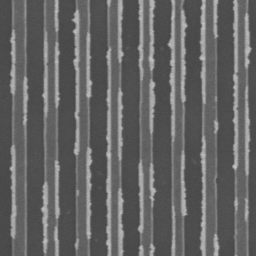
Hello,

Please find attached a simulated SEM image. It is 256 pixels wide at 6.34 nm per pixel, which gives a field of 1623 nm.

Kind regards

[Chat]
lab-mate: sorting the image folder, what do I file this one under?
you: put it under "parallel lines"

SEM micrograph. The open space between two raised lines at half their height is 109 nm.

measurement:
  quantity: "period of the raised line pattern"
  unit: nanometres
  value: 201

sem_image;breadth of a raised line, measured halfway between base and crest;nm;91.1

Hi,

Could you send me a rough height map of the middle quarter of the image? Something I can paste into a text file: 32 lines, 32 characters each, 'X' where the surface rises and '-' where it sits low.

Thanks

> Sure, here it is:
---XXX-----XXX-----XXX-----XXX--
---XXX-----XXX-----XXX-----XXX--
---XXX-----XXX-----XXX-----XXX--
---XXX-----XXX-----XXX-----XXX--
---XXXX----XXX-----XXX----XXXX--
---XXXX----XXX-----XXXX----XXX--
---XXXX----XXX-----XXX-----XXX--
---XXXX----XXX-----XXXX----XXX--
---XXX-----XXX-----XXXX----XXX--
---XXX-----XXX-----XXXX----XXX--
---XXX-----XXXX----XXX-----XXX--
---XXX-----XXX-----XXX-----XXX--
---XXX-----XXX-----XXX-----XXX--
---XXX-----XXX-----XXX-----XXX--
---XXX-----XXX-----XXX-----XXX--
---XXX-----XXXX----XXX-----XXX--
---XXX-----XXXX----XXX-----XXX--
---XXX-----XXX-----XXX-----XXX--
---XXX-----XXXX----XXX-----XXX--
---XXX-----XXXX----XXX-----XXX--
---XXX-----XXXX----XXX-----XXX--
---XXXX----XXX-----XXX-----XXX--
---XXXX----XXX-----XXX-----XXX--
---XXXX----XXX-----XXX-----XXX--
---XXXX----XXX-----XXX-----XXX--
---XXX-----XXX-----XXX-----XXX--
---XXX-----XXX-----XXX-----XXX--
---XXXX----XXX-----XXX-----XXX--
---XXXX----XXX-----XXX-----XXX--
---XXXX----XXX-----XXX-----XXX--
---XXXX----XXX-----XXX-----XXX--
---XXXX----XXX-----XXXX----XXX--